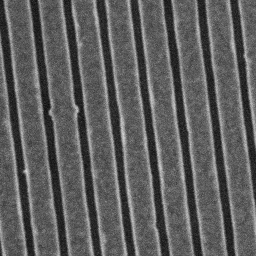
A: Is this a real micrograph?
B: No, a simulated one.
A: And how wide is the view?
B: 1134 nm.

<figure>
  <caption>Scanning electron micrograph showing parallel lines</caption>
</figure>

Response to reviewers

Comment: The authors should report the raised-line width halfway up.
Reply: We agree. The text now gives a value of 106 nm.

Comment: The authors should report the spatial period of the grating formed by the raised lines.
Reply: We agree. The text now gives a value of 147 nm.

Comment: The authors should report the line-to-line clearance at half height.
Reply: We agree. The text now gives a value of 40.6 nm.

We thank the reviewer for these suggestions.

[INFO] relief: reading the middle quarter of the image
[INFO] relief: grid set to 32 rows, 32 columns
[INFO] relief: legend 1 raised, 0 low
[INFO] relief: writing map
10001111110011111100011111000111
11001111110001111100011111100111
11001111110001111100011111100111
11001111110001111110011111100111
11000111110001111110011111100111
11000111110001111110011111100011
11000111111001111110011111100011
11000111111001111110001111100011
11000111111001111110001111100011
11000111111000111110001111110011
11100111111000111110001111110011
11110111111000111111001111110011
11100111111000111111001111110011
11100011111000111111001111110001
11100011111000111111001111110001
11100011111100111111001111110001
11100011111100011111000111110001
11100011111100111111000111111001
11110011111100011111000111111001
11110011111100011111100111111000
11110001111100011111100111111000
11110001111100011111100111111000
11110001111110011111100111111000
11110001111110011111100111111100
11111001111110011111100011111100
11111001111110011111100011111100
11111001111110011111110011111100
11111001111110011111110011111100
11111001111110001111110011111100
11111001111110001111110011111100
11111000111110001111110001111100
11111000111110001111110011111100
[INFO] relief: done